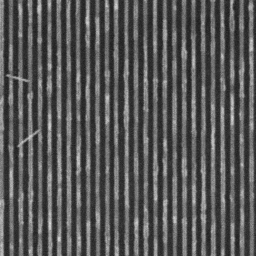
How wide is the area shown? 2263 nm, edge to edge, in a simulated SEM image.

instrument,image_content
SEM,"parallel lines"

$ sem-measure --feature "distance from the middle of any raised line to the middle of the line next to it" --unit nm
85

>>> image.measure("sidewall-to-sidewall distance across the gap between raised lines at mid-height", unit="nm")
55.2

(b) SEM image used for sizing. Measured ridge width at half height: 0.0309 microns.